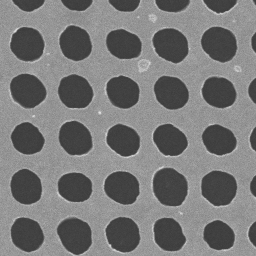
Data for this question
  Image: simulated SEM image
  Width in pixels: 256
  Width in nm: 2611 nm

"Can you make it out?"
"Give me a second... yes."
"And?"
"a regular array of holes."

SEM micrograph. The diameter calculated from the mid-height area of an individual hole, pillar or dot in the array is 344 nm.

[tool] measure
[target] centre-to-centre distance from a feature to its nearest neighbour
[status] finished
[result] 481 nanometers